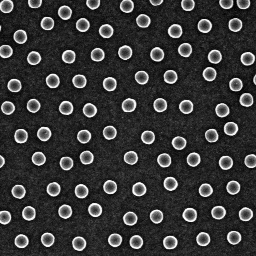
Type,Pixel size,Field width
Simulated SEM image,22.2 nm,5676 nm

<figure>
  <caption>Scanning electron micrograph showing a regular array of raised bodies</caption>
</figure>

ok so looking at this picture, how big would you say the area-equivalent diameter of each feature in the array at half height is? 0.284 micrometres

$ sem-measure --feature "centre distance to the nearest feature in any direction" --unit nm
559